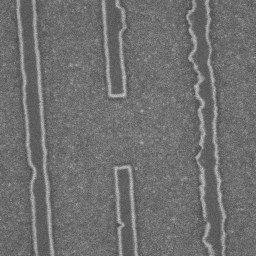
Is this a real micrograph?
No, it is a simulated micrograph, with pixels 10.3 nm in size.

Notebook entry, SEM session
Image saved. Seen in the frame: one or a few lines or trenches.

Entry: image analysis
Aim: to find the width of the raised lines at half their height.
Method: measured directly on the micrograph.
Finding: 0.16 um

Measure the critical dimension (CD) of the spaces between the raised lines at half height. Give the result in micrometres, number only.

0.719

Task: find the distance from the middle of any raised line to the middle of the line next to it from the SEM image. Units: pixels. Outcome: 85.8